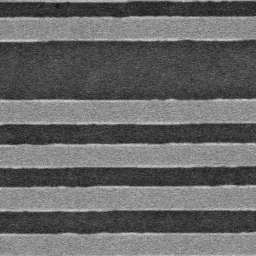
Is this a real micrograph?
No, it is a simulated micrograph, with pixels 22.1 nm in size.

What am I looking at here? lines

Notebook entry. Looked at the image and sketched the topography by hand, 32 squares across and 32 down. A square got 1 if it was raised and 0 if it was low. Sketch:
00000000000000000000000000000000
00000000000000000000000000000000
11111111111111111111111111111111
11111111111111111111111111111111
11111111111111111111111111111111
00000000000000000000000000000000
00000000000000000000000000000000
00000000000000000000000000000000
00000000000000000000000000000000
00000000000000000000000000000000
00000000000000000000000000000000
00000000000000000000000000000000
00000000000000000000000000000000
11111111111111111111111111111111
11111111111111111111111111111111
00000000000000000000000000000000
00000000000000000000000000000000
00000000000000000000000000000000
11111111111111111111111111111111
11111111111111111111111111111111
11111111111111111111111111111111
00000000000000000000000000000000
00000000000000000000000000000000
00000000000111111111111111111111
11111111111111111111111111111111
11111111111111111111111111111111
00000000000000000000000000000000
00000000000000000000000000000000
00000000000000000000000000000000
11111111111111111111111111111111
11111111111111111111111111111111
11111111111111111111111111111111